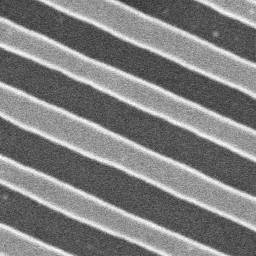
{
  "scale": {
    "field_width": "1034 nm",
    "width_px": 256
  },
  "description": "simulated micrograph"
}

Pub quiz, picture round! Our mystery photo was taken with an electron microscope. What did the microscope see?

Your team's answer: lines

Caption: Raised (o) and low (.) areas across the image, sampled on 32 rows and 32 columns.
......ooooooooo...........oooooo
........ooooooooo..........ooooo
o..........ooooooooo..........oo
ooo..........ooooooooo..........
ooooo.........oooooooooo........
ooooooo..........ooooooooo......
..oooooooo.........oooooooooo...
....oooooooo..........ooooooooo.
......oooooooo..........oooooooo
.........oooooooo.........oooooo
...........oooooooo.........oooo
ooo..........oooooooo..........o
ooooo..........oooooooo.........
ooooooo..........oooooooo.......
ooooooooo...........oooooooo....
..oooooooooo..........oooooooo..
....oooooooooo..........oooooooo
......oooooooooo..........oooooo
.........ooooooooo..........oooo
...........ooooooooo..........oo
oo............ooooooooo.........
ooooo...........ooooooooo.......
ooooooo...........ooooooooo.....
.oooooooo...........ooooooooo...
....ooooooo...........ooooooooo.
.....oooooooo............ooooooo
.......ooooooooo...........ooooo
..........oooooooo...........ooo
o...........oooooooo...........o
ooo............oooooooo.........
oooooo...........oooooooo.......
oooooooo...........oooooooo.....